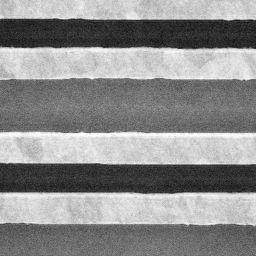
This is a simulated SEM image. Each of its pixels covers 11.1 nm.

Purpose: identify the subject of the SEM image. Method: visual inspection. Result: lines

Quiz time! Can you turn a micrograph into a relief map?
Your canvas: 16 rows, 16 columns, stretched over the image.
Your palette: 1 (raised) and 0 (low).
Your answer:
1111111111111111
0000000000000000
0000000000000000
1111111111111111
1111111111111111
0000000000000000
0000000000000000
0000000000000000
1111111111111111
1111111111111111
0000000000000000
0000000000000000
1111111111111111
1111111111111111
0000000000000000
0000000000000000